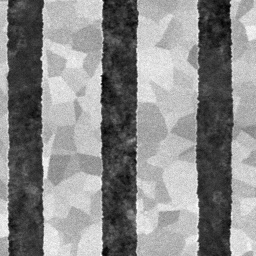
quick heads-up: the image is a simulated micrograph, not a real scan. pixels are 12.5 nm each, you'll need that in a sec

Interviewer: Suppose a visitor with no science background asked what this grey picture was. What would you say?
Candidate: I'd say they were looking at one or a few lines or trenches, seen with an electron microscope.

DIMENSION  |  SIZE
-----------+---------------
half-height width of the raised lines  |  738 nanometers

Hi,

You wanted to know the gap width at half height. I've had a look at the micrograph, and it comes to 444 nanometres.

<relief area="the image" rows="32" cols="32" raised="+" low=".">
+.....+++++++....++++++++....+++
+....++++++++....++++++++....+++
+....++++++++....++++++++....+++
+....++++++++....++++++++....+++
+....++++++++....++++++++....+++
+....++++++++....++++++++....+++
+....++++++++....++++++++....+++
+....++++++++....++++++++....+++
+....++++++++....++++++++....+++
+....++++++++....++++++++....+++
+....++++++++....++++++++....+++
+....++++++++....++++++++....+++
+....++++++++....++++++++....+++
+....++++++++....++++++++....+++
+....++++++++....++++++++....+++
+....++++++++....++++++++....+++
+....++++++++....++++++++....+++
+....++++++++....+++++++.....+++
+....++++++++....+++++++.....+++
+....++++++++....+++++++.....+++
+....++++++++....+++++++.....+++
+.....+++++++....++++++++....+++
+....++++++++....++++++++....+++
+....++++++++....++++++++....+++
+....++++++++....++++++++....+++
+....++++++++....++++++++....+++
+....++++++++....++++++++....+++
+.....+++++++....++++++++....+++
+.....+++++++....++++++++....+++
+.....+++++++....++++++++....+++
+.....+++++++....++++++++....+++
+.....+++++++....++++++++....+++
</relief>